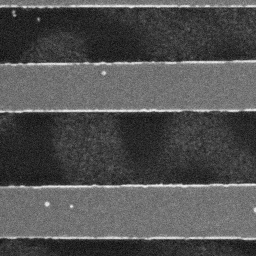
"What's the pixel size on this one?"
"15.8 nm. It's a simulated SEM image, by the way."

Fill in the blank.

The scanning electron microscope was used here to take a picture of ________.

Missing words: lines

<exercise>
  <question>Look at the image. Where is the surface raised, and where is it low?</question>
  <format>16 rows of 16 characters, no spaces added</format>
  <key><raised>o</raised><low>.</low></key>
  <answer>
................
................
................
................
oooooooooooooooo
oooooooooooooooo
oooooooooooooooo
................
................
................
................
................
oooooooooooooooo
oooooooooooooooo
oooooooooooooooo
................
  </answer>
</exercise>